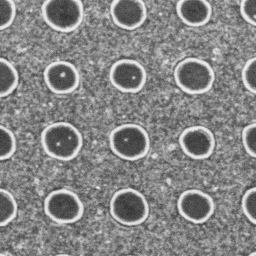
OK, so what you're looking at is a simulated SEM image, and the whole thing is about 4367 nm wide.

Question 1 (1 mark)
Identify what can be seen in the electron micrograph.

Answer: a regular array of raised bodies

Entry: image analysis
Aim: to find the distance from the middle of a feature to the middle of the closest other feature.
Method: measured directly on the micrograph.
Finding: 65.2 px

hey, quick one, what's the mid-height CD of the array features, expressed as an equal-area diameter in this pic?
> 0.565 micrometres